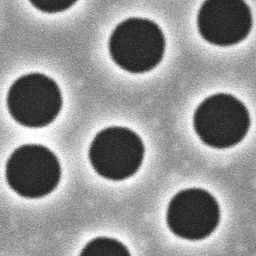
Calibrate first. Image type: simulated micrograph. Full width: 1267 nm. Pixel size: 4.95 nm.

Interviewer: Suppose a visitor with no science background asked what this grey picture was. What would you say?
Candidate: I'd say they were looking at holes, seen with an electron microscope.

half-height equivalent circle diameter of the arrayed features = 280 nm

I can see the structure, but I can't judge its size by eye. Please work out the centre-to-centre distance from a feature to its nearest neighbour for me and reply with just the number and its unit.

453 nm